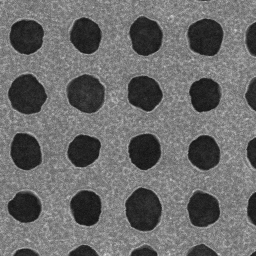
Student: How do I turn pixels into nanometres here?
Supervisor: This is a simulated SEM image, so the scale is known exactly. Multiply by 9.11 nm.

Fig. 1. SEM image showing a regular array of holes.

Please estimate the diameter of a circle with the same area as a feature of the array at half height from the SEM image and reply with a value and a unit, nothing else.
34.5 pixels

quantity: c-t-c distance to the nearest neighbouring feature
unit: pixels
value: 57